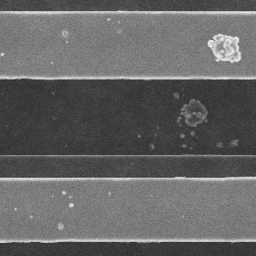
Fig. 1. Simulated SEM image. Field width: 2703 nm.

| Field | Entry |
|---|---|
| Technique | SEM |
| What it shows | lines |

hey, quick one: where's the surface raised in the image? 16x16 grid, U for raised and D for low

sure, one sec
UUUUUUUUUUUUUUUU
UUUUUUUUUUUUUUUU
UUUUUUUUUUUUUUUU
UUUUUUUUUUUUUUUU
UUUUUUUUUUUUUUUU
DDDDDDDDDDDDDDDD
DDDDDDDDDDDDDDDD
DDDDDDDDDDDDDDDD
DDDDDDDDDDDDDDDD
DDDDDDDDDDDDDDDD
UUUUUUUUUUUUUUUU
UUUUUUUUUUUUUUUU
UUUUUUUUUUUUUUUU
UUUUUUUUUUUUUUUU
UUUUUUUUUUUUUUUU
DDDDDDDDDDDDDDDD